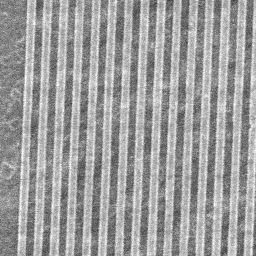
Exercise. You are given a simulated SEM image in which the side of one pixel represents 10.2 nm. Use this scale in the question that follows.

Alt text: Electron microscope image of parallel lines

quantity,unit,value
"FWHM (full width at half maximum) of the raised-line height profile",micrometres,0.0704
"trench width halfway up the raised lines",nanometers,101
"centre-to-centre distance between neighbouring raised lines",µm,0.166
